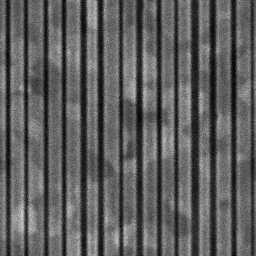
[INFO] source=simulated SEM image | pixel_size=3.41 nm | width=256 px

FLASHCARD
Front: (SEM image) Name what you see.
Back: parallel lines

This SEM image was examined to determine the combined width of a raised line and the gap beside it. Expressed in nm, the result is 64.4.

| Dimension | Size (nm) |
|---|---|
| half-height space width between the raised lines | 22.2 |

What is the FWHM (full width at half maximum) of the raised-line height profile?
0.0413 µm